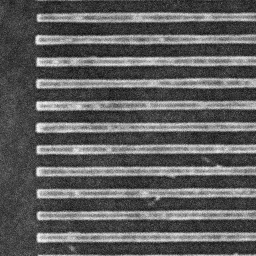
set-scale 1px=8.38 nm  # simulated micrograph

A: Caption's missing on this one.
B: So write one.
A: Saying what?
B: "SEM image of parallel lines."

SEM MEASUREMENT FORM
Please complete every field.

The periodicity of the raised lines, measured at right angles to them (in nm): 184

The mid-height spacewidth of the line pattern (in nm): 122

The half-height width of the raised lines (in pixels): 7.26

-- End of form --